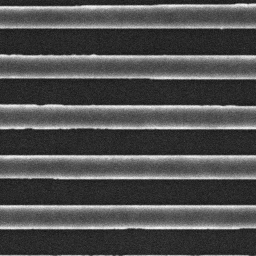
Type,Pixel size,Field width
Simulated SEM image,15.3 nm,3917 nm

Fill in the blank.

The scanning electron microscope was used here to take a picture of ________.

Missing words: lines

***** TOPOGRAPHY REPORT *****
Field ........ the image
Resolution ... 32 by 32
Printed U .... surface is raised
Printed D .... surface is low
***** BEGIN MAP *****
DDDDDDDDDDDDDDDDDDDDDDDDDDDDDDDD
UUUUUUUUUUUUUUUUUUUUUUUUUUUUUUUU
UUUUUUUUUUUUUUUUUUUUUUUUUUUUUUUU
DDDDDDDDDDDDDDDDDDDDDDDDDDDDDDDD
DDDDDDDDDDDDDDDDDDDDDDDDDDDDDDDD
DDDDDDDDDDDDDDDDDDDDDDDDDDDDDDDD
DDDDDDDDDDDDDDDDDDDDDDDDDDDDDDDD
UUUUUUUUUUUUUUUUUUUUUUUUUUUUUUUU
UUUUUUUUUUUUUUUUUUUUUUUUUUUUUUUU
UUUUUUUUUUUUUUUUUUUUUUUUUUUUUUUU
DDDDDDDDDDDDDDDDDDDDDDDDDDDDDDDD
DDDDDDDDDDDDDDDDDDDDDDDDDDDDDDDD
DDDDDDDDDDDDDDDDDDDDDDDDDDDDDDDD
UUUUUUUUUUUUUUUUUUUUUUUUUUUUUUUU
UUUUUUUUUUUUUUUUUUUUUUUUUUUUUUUU
UUUUUUUUUUUUUUUUUUUUUUUUUUUUUUUU
DDDDDDDDDDDDDDDDDDDDDDDDDDDDDDDD
DDDDDDDDDDDDDDDDDDDDDDDDDDDDDDDD
DDDDDDDDDDDDDDDDDDDDDDDDDDDDDDDD
UUUUUUUUUUUDDDDUUUUDDUUUUDUUUDUU
UUUUUUUUUUUUUUUUUUUUUUUUUUUUUUUU
UUUUUUUUUUUUUUUUUUUUUUUUUUUUUUUU
DDDDDDDDDDDDDDDDDDDDDDDDDDDDDDDD
DDDDDDDDDDDDDDDDDDDDDDDDDDDDDDDD
DDDDDDDDDDDDDDDDDDDDDDDDDDDDDDDD
DDDDDDDDDDDDDDDDDDDDDDDDDDDDDDDD
UUUUUUUUUUUUUUUUUUUUUUUUUUUUUUUU
UUUUUUUUUUUUUUUUUUUUUUUUUUUUUUUU
UUUUUUUUUUUUUUUUDDUUUUUUUUUUUUDD
DDDDDDDDDDDDDDDDDDDDDDDDDDDDDDDD
DDDDDDDDDDDDDDDDDDDDDDDDDDDDDDDD
DDDDDDDDDDDDDDDDDDDDDDDDDDDDDDDD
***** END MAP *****